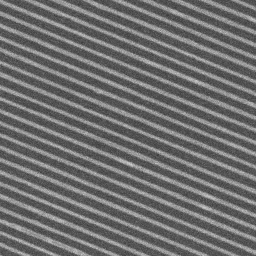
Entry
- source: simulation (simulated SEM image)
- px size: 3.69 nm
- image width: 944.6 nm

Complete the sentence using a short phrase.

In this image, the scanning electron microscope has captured parallel lines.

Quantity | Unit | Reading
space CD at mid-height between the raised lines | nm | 29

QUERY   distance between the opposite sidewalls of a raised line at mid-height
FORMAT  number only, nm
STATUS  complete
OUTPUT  11.5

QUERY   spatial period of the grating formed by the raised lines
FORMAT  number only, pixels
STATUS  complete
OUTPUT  11.3